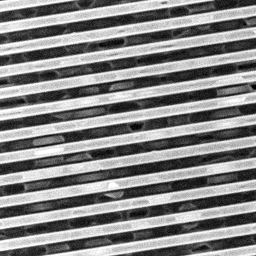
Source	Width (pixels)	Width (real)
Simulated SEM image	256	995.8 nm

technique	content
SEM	parallel lines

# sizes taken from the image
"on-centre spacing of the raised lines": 0.0837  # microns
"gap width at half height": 46.2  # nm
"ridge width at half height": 8.89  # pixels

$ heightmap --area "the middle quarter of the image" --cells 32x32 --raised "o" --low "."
......................oooooooooo
...............oooooooooooooo...
.........oooooooooooooo.........
...ooooooooooooo................
oooooooooo.....................o
ooo......................ooooooo
...................ooooooooooooo
............oooooooooooooo......
......ooooooooooooo.............
ooooooooooooo...................
oooooo....................oooooo
....................oooooooooooo
..............ooooooooooooooo...
.......ooooooooooooooo..........
.ooooooooooooooo................
ooooooooo.....................oo
ooo....................ooooooooo
.................oooooooooooooo.
..........ooooooooooooooo.......
....ooooooooooooooo.............
ooooooooooooo...................
oooooo....................oooooo
....................oooooooooooo
.............oooooooooooooooo...
.......ooooooooooooooo..........
oooooooooooooooo................
ooooooooo....................ooo
ooo....................ooooooooo
................oooooooooooooo..
..........oooooooooooooo........
...oooooooooooooo...............
ooooooooooo.....................